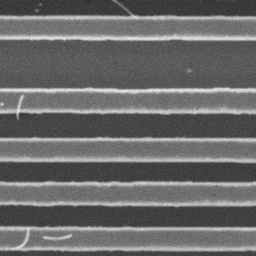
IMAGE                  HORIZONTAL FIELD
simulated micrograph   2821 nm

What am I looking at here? lines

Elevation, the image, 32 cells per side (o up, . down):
................................
................................
oooooooooooooooooooooooooooooooo
oooooooooooooooooooooooooooooooo
oooooooooooooooooooooooooooooooo
................................
................................
................................
................................
................................
................................
oooooooooooooooooooooooooooooooo
oooooooooooooooooooooooooooooooo
oooooooooooooooooooooooooooooooo
................................
................................
................................
oooooooooooooooooooooooooooooooo
oooooooooooooooooooooooooooooooo
oooooooooooooooooooooooooooooooo
................................
................................
................................
oooooooooooooooooooooooooooooooo
oooooooooooooooooooooooooooooooo
..oooooooooooooooooooooooooooooo
................................
................................
oooooooooooooooooooooooooooooooo
oooooooooooooooooooooooooooooooo
oooooooooooooooooooooooooooooooo
................................